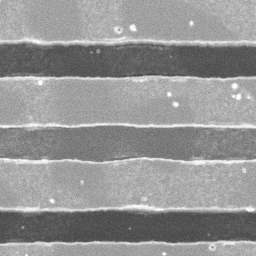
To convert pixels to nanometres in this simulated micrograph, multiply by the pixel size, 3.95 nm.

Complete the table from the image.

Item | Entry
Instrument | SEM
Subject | lines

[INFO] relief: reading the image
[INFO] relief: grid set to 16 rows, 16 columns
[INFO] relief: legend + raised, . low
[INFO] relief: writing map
++++++++++++++++
++++++++++++++++
++++++++++++++++
................
................
++++++++++++++++
++++++++++++++++
++++++++++++++++
+...+++++++++...
+..+++++++++++..
++++++++++++++++
++++++++++++++++
++++++++++++++++
................
................
++++++++++++++++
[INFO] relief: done